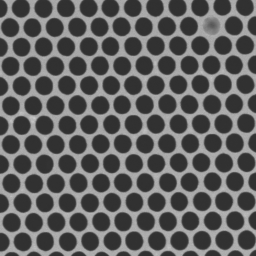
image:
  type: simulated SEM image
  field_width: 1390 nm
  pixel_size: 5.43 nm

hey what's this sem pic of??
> a regular array of holes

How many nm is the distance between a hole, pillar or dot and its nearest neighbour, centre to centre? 120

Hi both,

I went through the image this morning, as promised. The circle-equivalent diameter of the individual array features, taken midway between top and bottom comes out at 0.0971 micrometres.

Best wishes